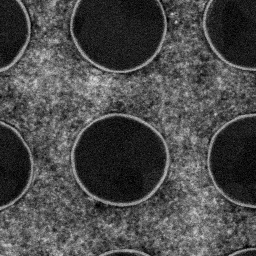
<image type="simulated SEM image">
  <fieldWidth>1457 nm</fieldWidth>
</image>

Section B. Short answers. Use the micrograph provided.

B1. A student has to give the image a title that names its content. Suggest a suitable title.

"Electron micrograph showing raised bodies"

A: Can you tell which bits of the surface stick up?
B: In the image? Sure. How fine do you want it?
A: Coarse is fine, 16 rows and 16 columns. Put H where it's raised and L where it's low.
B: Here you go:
HLLLLHHHHHLLLHHH
HHLLHHHHHHLLLHHH
HHLLLHHHHHLLLHHH
HLLLLHHHHHLLLLHH
LLLLLLLLLLLLLLLL
LLLLLLLLLLLLLLLL
LLLLLLLLLLLLLLLL
LLLLLLHHHLLLLLLH
HLLLLHHHHHLLLHHH
HHLLLHHHHHLLLHHH
HHLLLHHHHHLLLHHH
HHLLLHHHHHLLLHHH
HLLLLLHHHLLLLLHH
LLLLLLLLLLLLLLLL
LLLLLLLLLLLLLLLL
LLLLLLLLLLLLLLLL